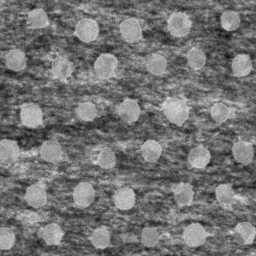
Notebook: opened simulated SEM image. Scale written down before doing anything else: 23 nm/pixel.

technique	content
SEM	a regular array of raised bodies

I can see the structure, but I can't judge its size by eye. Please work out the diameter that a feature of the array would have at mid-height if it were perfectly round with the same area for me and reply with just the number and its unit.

0.47 µm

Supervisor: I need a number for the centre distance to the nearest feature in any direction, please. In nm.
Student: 955